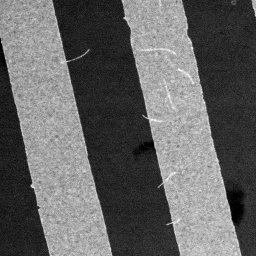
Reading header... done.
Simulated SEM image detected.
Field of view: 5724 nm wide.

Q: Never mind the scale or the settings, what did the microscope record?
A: one or a few lines or trenches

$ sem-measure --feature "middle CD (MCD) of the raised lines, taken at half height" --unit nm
1310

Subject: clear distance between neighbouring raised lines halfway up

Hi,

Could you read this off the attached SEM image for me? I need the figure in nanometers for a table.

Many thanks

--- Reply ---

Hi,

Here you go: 1510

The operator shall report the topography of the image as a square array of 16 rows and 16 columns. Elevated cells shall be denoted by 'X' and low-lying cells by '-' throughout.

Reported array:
XXX-----XXX-----
XXXX----XXXX----
XXXX----XXXX----
XXXX----XXXX----
-XXX-----XXX----
-XXXX----XXXX---
-XXXX----XXXX---
-XXXX----XXXX---
-XXXX-----XXX---
--XXX-----XXX---
--XXXX----XXXX--
--XXXX----XXXX--
--XXXX----XXXX--
---XXX-----XXX--
---XXXX----XXXX-
---XXXX----XXXX-